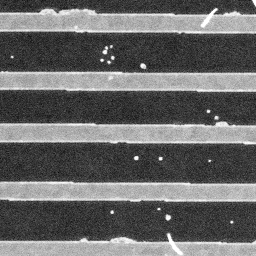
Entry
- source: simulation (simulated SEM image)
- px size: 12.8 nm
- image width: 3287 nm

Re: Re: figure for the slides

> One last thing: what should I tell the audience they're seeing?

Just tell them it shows lines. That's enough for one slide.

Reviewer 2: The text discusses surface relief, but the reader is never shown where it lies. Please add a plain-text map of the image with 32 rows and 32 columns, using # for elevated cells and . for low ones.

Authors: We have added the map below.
................................
.....##.###.....................
################################
################################
................................
................................
................................
................................
................................
################################
################################
................................
................................
................................
................................
...........................#....
################################
################################
................................
................................
................................
................................
................................
################################
################################
................................
................................
................................
................................
................................
################################
################################